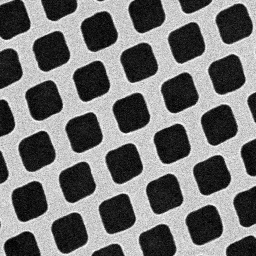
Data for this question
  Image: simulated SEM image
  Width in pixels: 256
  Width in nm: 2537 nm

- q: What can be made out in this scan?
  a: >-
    a regular array of holes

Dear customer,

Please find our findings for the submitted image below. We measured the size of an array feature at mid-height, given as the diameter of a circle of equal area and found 0.368 microns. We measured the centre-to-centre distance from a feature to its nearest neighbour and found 0.502 µm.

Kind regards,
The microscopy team